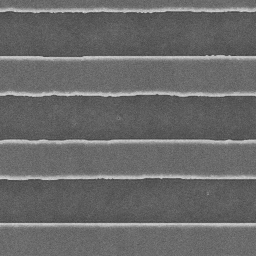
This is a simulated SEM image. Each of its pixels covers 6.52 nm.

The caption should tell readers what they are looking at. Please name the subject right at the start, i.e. lines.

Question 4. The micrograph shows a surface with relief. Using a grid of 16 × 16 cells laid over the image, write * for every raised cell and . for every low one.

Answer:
****************
................
................
................
****************
****************
................
................
................
****************
****************
................
................
................
****************
****************